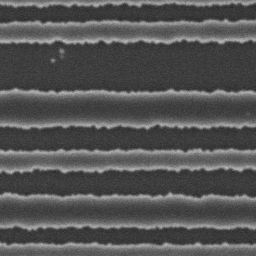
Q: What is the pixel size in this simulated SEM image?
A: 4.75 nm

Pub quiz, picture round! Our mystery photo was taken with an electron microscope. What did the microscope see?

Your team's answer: lines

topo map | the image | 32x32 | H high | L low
HHHHHHHHHHHHHLHLHHLHLLHHHHHHLLHL
LLLLLLLLLLLLLLLLLLLLLLLLLLLLLLLL
LLLLLLLLLLLLLLLLLLLLLLLLLLHLLLLL
HHHHHHHHHHHHHHHHHHHHHHHHHHHHHHHH
HHHHHHHHHHHHHHHHHHHHHHHHHHHHHHHH
LLLLLLLLLLLLLLLLLLLLLLLLLLLLLLLL
LLLLLLLLLLLLLLLLLLLLLLLLLLLLLLLL
LLLLLLLLLLLLLLLLLLLLLLLLLLLLLLLL
LLLLLLLLLLLLLLLLLLLLLLLLLLLLLLLL
LLLLLLLLLLLLLLLLLLLLLLLLLLLLLLLL
LLLLLLLLLLLLLLLLLLLLLLLLLLLLLLLL
HHHHHLHLHHHHHHLLLLLLHHHHHLLHLLHH
HHHHHHHHHHHHHHHHHHHHHHHHHHHHHHHH
HHHHHHHHHHHHHHHHHHHHHHHHHHHHHHHH
HHHHHHHHHHHHHHHHHHHHHHHHHHHHHHHH
HHHHHHHHHHHHHHHHHHHHHHHHHHHHHHHH
LLLLLLLLLLLLLLLLLLLLLLLLLLLLLLLL
LLLLLLLLLLLLLLLLLLLLLLLLLLLLLLLL
LLLLLLLLLLLLLLLLLLLLLLLLLLLLLLLL
HHHHHHHHHHHHHHHHHHHHHHHHHHHHHHHH
HHHHHHHHHHHHHHHHHHHHHHHHHHHHHHHH
LHLLLLLLLLLLLLLLLLLLLLLLLLLLLLLL
LLLLLLLLLLLLLLLLLLLLLLLLLLLLLLLL
LLLLLLLLLLLLLLLLLLLLLLLLLLLLLLLL
HHHHHHHLLHHHLHHHHHHLHHHLLLHHLLHL
HHHHHHHHHHHHHHHHHHHHHHHHHHHHHHHH
HHHHHHHHHHHHHHHHHHHHHHHHHHHHHHHH
HHHHHHHHHHHHHHHHHHHHHHHHHHHHHHHH
LLLHHLLLLLLLLLLLLLHLLLLLLLLHHLLH
LLLLLLLLLLLLLLLLLLLLLLLLLLLLLLLL
LLLLLLLLHHLHLLLLLLLLLLLLLLLLLLLL
HHHHHHHHHHHHHHHHHHHHHHHHHHHHHHHH